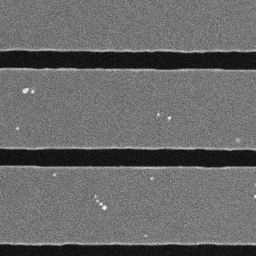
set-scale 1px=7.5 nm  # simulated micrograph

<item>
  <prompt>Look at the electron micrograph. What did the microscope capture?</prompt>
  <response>lines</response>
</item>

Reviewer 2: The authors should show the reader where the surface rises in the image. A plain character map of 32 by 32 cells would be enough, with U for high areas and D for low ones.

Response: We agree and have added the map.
UUUUUUUUUUUUUUUUUUUUUUUUUUUUUUUU
UUUUUUUUUUUUUUUUUUUUUUUUUUUUUUUU
UUUUUUUUUUUUUUUUUUUUUUUUUUUUUUUU
UUUUUUUUUUUUUUUUUUUUUUUUUUUUUUUU
UUUUUUUUUUUUUUUUUUUUUUUUUUUUUUUU
UUUUUUUUUUUUUUUUUUUUUUUUUUUUUUUU
DDDDDDDDDDDDDDDDUUDDDDUUUUDUUDUD
DDDDDDDDDDDDDDDDDDDDDDDDDDDDDDDD
DDDDDDDDDDDDDDDDDDDDDDDDDDDDDDDD
UUUUUUUUUUUUUUUUUUUUUUUUUUUUUUUU
UUUUUUUUUUUUUUUUUUUUUUUUUUUUUUUU
UUUUUUUUUUUUUUUUUUUUUUUUUUUUUUUU
UUUUUUUUUUUUUUUUUUUUUUUUUUUUUUUU
UUUUUUUUUUUUUUUUUUUUUUUUUUUUUUUU
UUUUUUUUUUUUUUUUUUUUUUUUUUUUUUUU
UUUUUUUUUUUUUUUUUUUUUUUUUUUUUUUU
UUUUUUUUUUUUUUUUUUUUUUUUUUUUUUUU
UUUUUUUUUUUUUUUUUUUUUUUUUUUUUUUU
UUUUUUUUUUUUUUUUUUUUUUUUUUUUUUUU
DDDDDDDDDDDDDDDDDDDDDDDDDDDDDDDD
DDDDDDDDDDDDDDDDDDDDDDDDDDDDDDDD
UUUUUUUUUUUUUUUUUUUUUUUUUUUUUUUU
UUUUUUUUUUUUUUUUUUUUUUUUUUUUUUUU
UUUUUUUUUUUUUUUUUUUUUUUUUUUUUUUU
UUUUUUUUUUUUUUUUUUUUUUUUUUUUUUUU
UUUUUUUUUUUUUUUUUUUUUUUUUUUUUUUU
UUUUUUUUUUUUUUUUUUUUUUUUUUUUUUUU
UUUUUUUUUUUUUUUUUUUUUUUUUUUUUUUU
UUUUUUUUUUUUUUUUUUUUUUUUUUUUUUUU
UUUUUUUUUUUUUUUUUUUUUUUUUUUUUUUU
UUUUUUUUUUUUUUUUUUUUUUUUUUUUUUUU
DDDDDDDDDDDDDDDDDDDDDDDDDDDDDDDD